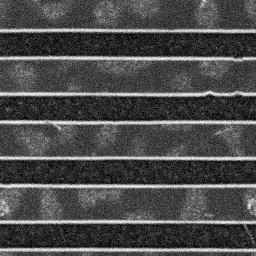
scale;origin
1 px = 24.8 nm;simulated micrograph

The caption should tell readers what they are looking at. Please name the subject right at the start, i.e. parallel lines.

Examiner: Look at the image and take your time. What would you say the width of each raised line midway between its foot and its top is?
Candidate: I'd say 911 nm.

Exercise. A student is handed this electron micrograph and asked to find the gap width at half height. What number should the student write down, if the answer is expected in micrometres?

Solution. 0.666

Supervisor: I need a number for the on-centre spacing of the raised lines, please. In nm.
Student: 1580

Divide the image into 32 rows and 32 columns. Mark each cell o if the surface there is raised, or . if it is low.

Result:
oooooooooooooooooooooooooooooooo
oooooooooooooooooooooooooooooooo
oooooooooooooooooooooooooooooooo
oooooooooooooooooooooooooooooooo
................................
................................
................................
oooooooooooooooooooooooooooooooo
oooooooooooooooooooooooooooooooo
oooooooooooooooooooooooooooooooo
oooooooooooooooooooooooooooooooo
oooooooooooooooooooooooooooooooo
................................
................................
................................
oooooooooooooooooooooooooooooooo
oooooooooooooooooooooooooooooooo
oooooooooooooooooooooooooooooooo
oooooooooooooooooooooooooooooooo
oooooooooooooooooooooooooooooooo
................................
................................
................................
oooooooooooooooooooooooooooooooo
oooooooooooooooooooooooooooooooo
oooooooooooooooooooooooooooooooo
oooooooooooooooooooooooooooooooo
oooooooooooooooooooooooooooooooo
................................
................................
................................
oooooooooooooooooooooooooooooooo